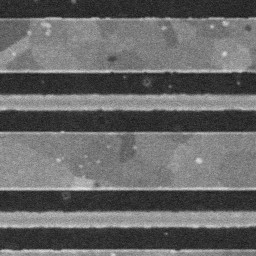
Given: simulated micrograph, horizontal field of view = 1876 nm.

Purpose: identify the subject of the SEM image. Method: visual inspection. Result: lines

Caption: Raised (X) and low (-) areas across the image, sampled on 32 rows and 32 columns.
--------------------------------
--------------------------------
XXXXXXXXXXXXXXXXXXXXXXXXXXXXXXXX
XXXXXXXXXXXXXXXXXXXXXXXXXXXXXXXX
XXXXXXXXXXXXXXXXXXXXXXXXXXXXXXXX
XXXXXXXXXXXXXXXXXXXXXXXXXXXXXXXX
XXXXXXXXXXXXXXXXXXXXXXXXXXXXXXXX
XXXXXXXXXXXXXXXXXXXXXXXXXXXXXXXX
XXXXXXXXXXXXXXXXXXXXXXXXXXXXXXXX
--------------------------------
--------------------------------
--------------------------------
--------------------------------
--------------------------------
--------------------------------
--------------------------------
-------X------------------------
XXXXXXXXXXXXXXXXXXXXXXXXXXXXXXXX
XXXXXXXXXXXXXXXXXXXXXXXXXXXXXXXX
XXXXXXXXXXXXXXXXXXXXXXXXXXXXXXXX
XXXXXXXXXXXXXXXXXXXXXXXXXXXXXXXX
XXXXXXXXXXXXXXXXXXXXXXXXXXXXXXXX
XXXXXXXXXXXXXXXXXXXXXXXXXXXXXXXX
XXXXXXXXXXXXXXXXXXXXXXXXXXXXXXXX
--------------------------------
--------------------------------
--------------------------------
--------------------------------
--------------------------------
--------------------------------
--------------------------------
XXXXXXXXXXXXXXXXXXXXXXXXXXXXXXXX